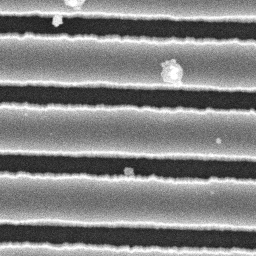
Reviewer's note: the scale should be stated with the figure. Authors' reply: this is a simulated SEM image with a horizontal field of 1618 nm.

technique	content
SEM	lines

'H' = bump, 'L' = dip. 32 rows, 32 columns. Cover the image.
HHHHHHHHHHHHHHHHHHHHHHHHHHHHHHHH
HHHHHHHHHHHHHHHHHHHHHHHHHHHHHHHH
LLLLLLLHLLLLLLLLLLLLLLLLLLLLLLLL
LLLLLLLLLLLLLLLLLLLLLLLLLLLLLLLL
HHLHHLLHLLLLLLLLLLLLLLLLLLLLLLLL
HHHHHHHHHHHHHHHHHHHHHHHHHHHHHHHH
HHHHHHHHHHHHHHHHHHHHHHHHHHHHHHHH
HHHHHHHHHHHHHHHHHHHHHHHHHHHHHHHH
HHHHHHHHHHHHHHHHHHHHHHHHHHHHHHHH
HHHHHHHHHHHHHHHHHHHHHHHHHHHHHHHH
LLLLLLHHHHHHHHHHHHHHHHHHHHHHHHHH
LLLLLLLLLLLLLLLLLLLLLLLLLLLLLLLL
LLLLLLLLLLLLLLLLLLLLLLLLLLLLLLLL
HHHHHHHHHHHHHHHHHLHLLLLLLLLLLLLL
HHHHHHHHHHHHHHHHHHHHHHHHHHHHHHHH
HHHHHHHHHHHHHHHHHHHHHHHHHHHHHHHH
HHHHHHHHHHHHHHHHHHHHHHHHHHHHHHHH
HHHHHHHHHHHHHHHHHHHHHHHHHHHHHHHH
HHHHHHHHHHHHHHHHHHHHHHHHHHHHHHHH
LLLLLLLLLLLLLLLHHHHHHHHHHHHHHHHH
LLLLLLLLLLLLLLLLLLLLLLLLLLLLLLLL
LLLLLLLLLLLLLLLLLLLLLLLLLLLLLLLL
HHHHHHHHHHHHHHHHHHHHHHLLLLHHHLLL
HHHHHHHHHHHHHHHHHHHHHHHHHHHHHHHH
HHHHHHHHHHHHHHHHHHHHHHHHHHHHHHHH
HHHHHHHHHHHHHHHHHHHHHHHHHHHHHHHH
HHHHHHHHHHHHHHHHHHHHHHHHHHHHHHHH
HHHHHHHHHHHHHHHHHHHHHHHHHHHHHHHH
LLLLLLLLLLLLLLLLLLLLLLLLLHLHHHHH
LLLLLLLLLLLLLLLLLLLLLLLLLLLLLLLL
LHLHLLLLLLLLLLLLLLLLLLLLLLLLLLLL
HHHHHHHHHHHHHHHHHHHHHHHHHHHHHHHH